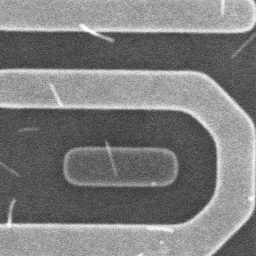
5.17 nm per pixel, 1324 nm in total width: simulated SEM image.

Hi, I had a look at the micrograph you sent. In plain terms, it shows wiring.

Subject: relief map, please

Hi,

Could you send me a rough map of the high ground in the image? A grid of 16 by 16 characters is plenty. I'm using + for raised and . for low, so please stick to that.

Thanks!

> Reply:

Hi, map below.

++++++++++++++++
++++++++++++++++
................
................
++++++++++++....
++++++++++++++..
+++++++++++++++.
............++++
.............+++
....+++++++...++
....+++++++...++
.....+++++....++
.............+++
............++++
+++++++++++++++.
++++++++++++++..